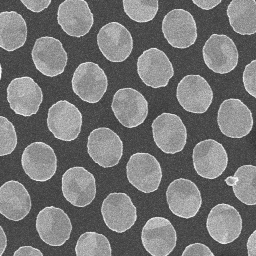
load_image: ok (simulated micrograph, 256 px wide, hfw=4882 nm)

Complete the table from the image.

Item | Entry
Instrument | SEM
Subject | a regular array of raised bodies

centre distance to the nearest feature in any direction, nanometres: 892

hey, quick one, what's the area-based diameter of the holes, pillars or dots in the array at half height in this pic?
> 704 nm